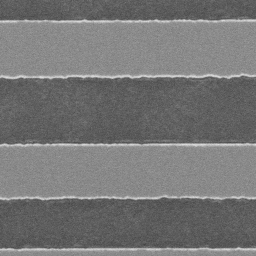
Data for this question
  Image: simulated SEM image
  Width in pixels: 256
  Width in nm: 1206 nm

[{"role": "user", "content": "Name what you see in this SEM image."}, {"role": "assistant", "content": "lines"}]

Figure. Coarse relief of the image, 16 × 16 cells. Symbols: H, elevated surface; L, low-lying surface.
LLLLLLLLLLLLLLLL
HHHHHHHHHHHHHHHH
HHHHHHHHHHHHHHHH
HHHHHHHHHHHHHHHH
HHHHHHHHHHHHHHHH
LLLLLLLLLLLLLLLL
LLLLLLLLLLLLLLLL
LLLLLLLLLLLLLLLL
LLLLLLLLLLLLLLLL
HHHHHHHHHHHHHHHH
HHHHHHHHHHHHHHHH
HHHHHHHHHHHHHHHH
LLLLLLLLLLLLLLLL
LLLLLLLLLLLLLLLL
LLLLLLLLLLLLLLLL
LLLLLLLLLLLLLLLL